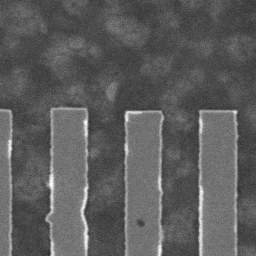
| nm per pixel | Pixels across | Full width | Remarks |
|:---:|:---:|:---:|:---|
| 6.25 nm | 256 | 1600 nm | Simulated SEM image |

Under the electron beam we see one or a few lines or trenches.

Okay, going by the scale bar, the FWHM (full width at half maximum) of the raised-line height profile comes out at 226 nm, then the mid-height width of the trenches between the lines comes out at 38.3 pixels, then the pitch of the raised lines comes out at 467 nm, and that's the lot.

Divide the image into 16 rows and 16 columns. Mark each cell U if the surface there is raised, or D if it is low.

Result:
DDDDDDDDDDDDDDDD
DDDDDDDDDDDDDDDD
DDDDDDDDDDDDDDDD
DDDDDDDDDDDDDDDD
DDDDDDDDDDDDDDDD
DDDDDDDDDDDDDDDD
DDDDDDDDDDDDDDDD
UDDUUDDDUUDDUUUD
UDDUUDDDUUDDUUUD
UDDUUUDDUUDDUUUD
UDDUUDDDUUDDUUUD
UDDUUDDDUUDDUUUD
UDDUUDDDUUDDUUUD
UDDUUDDDUUDDUUUD
UDDUUDDDUUDDUUUD
UDDUUDDDUUDDUUUD